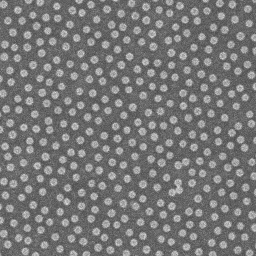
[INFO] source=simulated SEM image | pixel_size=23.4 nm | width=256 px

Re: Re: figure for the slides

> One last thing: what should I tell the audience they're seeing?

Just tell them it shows a regular array of raised bodies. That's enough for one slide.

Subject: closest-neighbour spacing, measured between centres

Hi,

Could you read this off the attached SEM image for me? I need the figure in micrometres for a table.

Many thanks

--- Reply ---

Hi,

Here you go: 0.276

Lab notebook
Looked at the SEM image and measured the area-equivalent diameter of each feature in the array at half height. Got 0.152 um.